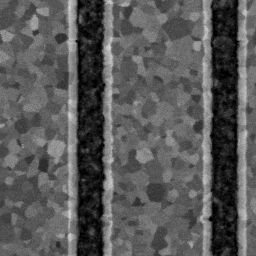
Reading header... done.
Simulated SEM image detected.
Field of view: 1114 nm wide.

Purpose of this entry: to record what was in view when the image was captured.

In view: one or a few lines or trenches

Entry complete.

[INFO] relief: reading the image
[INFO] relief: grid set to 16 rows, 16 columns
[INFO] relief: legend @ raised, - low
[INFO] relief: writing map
@@@@@--@@@@@@--@
@@@@@--@@@@@@--@
@@@@@--@@@@@@--@
@@@@@--@@@@@@--@
@@@@@--@@@@@@--@
@@@@@--@@@@@@--@
@@@@@--@@@@@@--@
@@@@@--@@@@@@--@
@@@@@--@@@@@@--@
@@@@@--@@@@@@--@
@@@@@--@@@@@@--@
@@@@@--@@@@@@--@
@@@@@--@@@@@@--@
@@@@@--@@@@@@--@
@@@@@--@@@@@@--@
@@@@@--@@@@@@--@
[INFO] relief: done